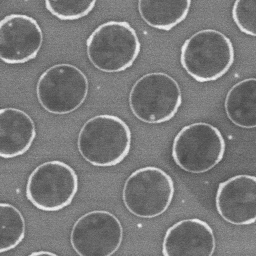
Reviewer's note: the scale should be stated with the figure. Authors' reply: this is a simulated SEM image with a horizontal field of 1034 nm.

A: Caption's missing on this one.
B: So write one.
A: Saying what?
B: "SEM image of a regular array of raised bodies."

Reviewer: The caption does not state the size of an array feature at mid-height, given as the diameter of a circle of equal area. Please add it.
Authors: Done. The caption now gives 50.5 pixels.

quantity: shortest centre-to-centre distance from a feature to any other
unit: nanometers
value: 267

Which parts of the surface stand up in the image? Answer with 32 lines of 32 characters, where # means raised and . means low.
......######.....#######.....###
......#####.......#####......###
####..............#####......###
#####.......####....#.........##
#####......######.......####....
#####......######......######...
#####......######......######...
####.......######......######...
......####..####.......######...
.....######.......###...####....
.....######......#####........##
.....######.....######.......###
.....#####......#######.....####
......####......######......####
###.........##...#####.......###
####.......#####.........#...###
####......######......#####.....
####......######......######....
####......######......######....
##........######......######....
.....###....##........#####.....
....#####........###....#.......
....######......#####........###
...#######......######.....#####
...######......######......#####
....#####.......#####......#####
##..........#...####.......#####
###.......#####........##...####
###......######......#####......
###......######......######.....
##.......######.....#######.....
.....#....####......#######.....